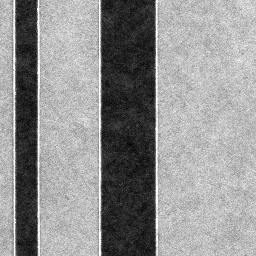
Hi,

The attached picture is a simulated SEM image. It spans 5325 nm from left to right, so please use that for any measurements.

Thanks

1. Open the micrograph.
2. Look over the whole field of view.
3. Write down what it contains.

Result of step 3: one or a few lines or trenches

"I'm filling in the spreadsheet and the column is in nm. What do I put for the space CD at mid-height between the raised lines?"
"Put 1250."